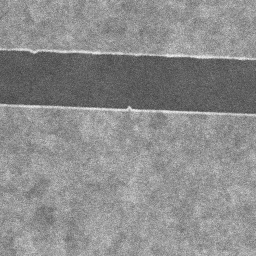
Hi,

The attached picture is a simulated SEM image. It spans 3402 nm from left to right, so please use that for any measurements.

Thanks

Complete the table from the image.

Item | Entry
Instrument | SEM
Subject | one or a few lines or trenches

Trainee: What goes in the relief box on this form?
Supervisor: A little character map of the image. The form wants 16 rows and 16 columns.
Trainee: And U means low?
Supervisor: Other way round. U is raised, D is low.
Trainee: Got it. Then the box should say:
UUUUUUUUUUUUUUUU
UUUUUUUUUUUUUUUU
UUUUUUUUUUUUUUUU
DDDDDDDDDDDDUUUU
DDDDDDDDDDDDDDDD
DDDDDDDDDDDDDDDD
DDDDDDDDDDDDDDDD
UUUUUUUUUUUUUUUU
UUUUUUUUUUUUUUUU
UUUUUUUUUUUUUUUU
UUUUUUUUUUUUUUUU
UUUUUUUUUUUUUUUU
UUUUUUUUUUUUUUUU
UUUUUUUUUUUUUUUU
UUUUUUUUUUUUUUUU
UUUUUUUUUUUUUUUU